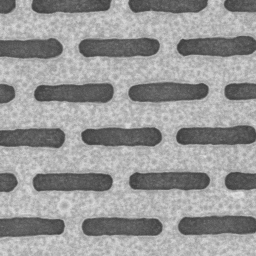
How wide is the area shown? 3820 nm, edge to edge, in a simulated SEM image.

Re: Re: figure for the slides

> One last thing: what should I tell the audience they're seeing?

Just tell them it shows holes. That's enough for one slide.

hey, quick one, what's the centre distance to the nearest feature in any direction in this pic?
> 949 nanometres